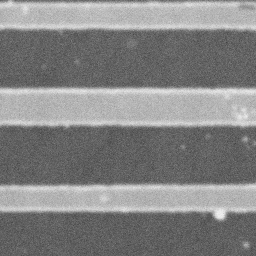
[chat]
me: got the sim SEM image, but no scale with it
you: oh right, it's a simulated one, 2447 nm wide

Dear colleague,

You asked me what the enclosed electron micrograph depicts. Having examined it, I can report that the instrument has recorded lines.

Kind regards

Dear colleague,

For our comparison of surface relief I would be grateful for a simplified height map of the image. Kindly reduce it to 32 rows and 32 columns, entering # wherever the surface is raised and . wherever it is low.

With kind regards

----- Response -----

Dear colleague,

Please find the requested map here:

..................##...#########
################################
################################
..............................##
................................
................................
................................
................................
................................
................................
................................
################################
################################
################################
################################
...#####...##..############..###
................................
................................
................................
................................
................................
................................
................................
################################
################################
################################
...........................#....
................................
................................
................................
................................
................................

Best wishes